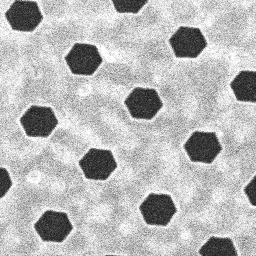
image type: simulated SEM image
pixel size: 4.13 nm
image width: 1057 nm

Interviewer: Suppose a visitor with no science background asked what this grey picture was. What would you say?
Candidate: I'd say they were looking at a regular array of holes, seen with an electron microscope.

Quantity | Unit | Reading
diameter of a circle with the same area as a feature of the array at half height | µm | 0.139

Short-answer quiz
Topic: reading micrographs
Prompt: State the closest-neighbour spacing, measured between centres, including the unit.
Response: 306 nanometres